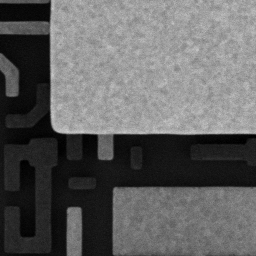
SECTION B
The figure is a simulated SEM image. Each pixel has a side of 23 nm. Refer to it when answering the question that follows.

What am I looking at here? wiring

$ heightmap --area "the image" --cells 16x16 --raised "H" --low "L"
LLLHHHHHHHHHHHHH
LLLHHHHHHHHHHHHH
LLLHHHHHHHHHHHHH
LLLHHHHHHHHHHHHH
LLLHHHHHHHHHHHHH
LLLHHHHHHHHHHHHH
LLLHHHHHHHHHHHHH
LLLHHHHHHHHHHHHH
LLLLLLLLLLLLLLLL
LLLLLLLLLLLLLLLL
LLLLLLLLLLLLLLLL
LLLLLLLLLLLLLLLL
LLLLLLLLLLLLLLLL
LLLLLLLLLLLLLLLL
LLLLLLLLLLLLLLLL
LLLLLLLLLLLLLLLL